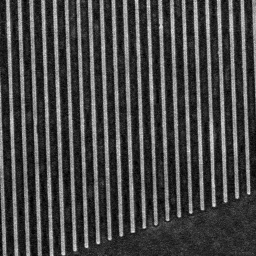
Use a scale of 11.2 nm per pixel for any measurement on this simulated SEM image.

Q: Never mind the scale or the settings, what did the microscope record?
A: parallel lines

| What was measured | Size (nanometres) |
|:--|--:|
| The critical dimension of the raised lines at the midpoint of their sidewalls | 36.4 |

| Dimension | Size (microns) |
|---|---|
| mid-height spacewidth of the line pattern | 0.0953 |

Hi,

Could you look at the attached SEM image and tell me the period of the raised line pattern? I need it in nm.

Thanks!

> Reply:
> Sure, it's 132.